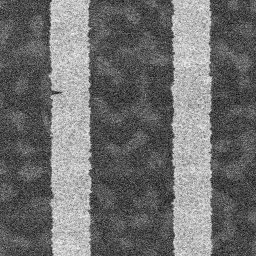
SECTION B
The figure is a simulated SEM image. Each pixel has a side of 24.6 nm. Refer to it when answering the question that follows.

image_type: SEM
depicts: one or a few lines or trenches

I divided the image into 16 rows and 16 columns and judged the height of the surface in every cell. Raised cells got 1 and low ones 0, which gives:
0001110000011000
0001110000011000
0001100000011000
0001110000011000
0001110000011000
0001110000011000
0001110000011000
0001110000011000
0001110000011000
0001110000011000
0001110000011000
0001110000011000
0001110000011000
0001110000011000
0001110000011000
0001110000011000